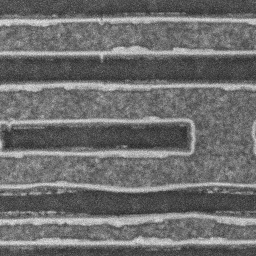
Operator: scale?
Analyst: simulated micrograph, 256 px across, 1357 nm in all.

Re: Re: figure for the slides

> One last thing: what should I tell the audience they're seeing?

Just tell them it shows one or a few lines or trenches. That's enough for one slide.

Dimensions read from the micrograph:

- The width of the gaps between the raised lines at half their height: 170 nm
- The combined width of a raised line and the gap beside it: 343 nanometres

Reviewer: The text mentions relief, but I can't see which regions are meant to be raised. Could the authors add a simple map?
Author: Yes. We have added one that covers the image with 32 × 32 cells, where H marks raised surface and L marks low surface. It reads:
LLLLLLLLLLLLLLLLLLLLLLLLLLLLLLLL
LLLLLLLLLLLLLLLLLLLLLLLLLLLLLLLL
LLLLLLLLLLLHLHHHHHHHHHHHHLLLLLLL
HHHHHHHHHHHHHHHHHHHHHHHHHHHHHHHH
HHHHHHHHHHHHHHHHHHHHHHHHHHHHHHHH
HHHHHHHHHHHHHHHHHHHHHHHHHHHHHHHH
HHHHHHHHHHHHHHHHHHHHHHHHHHHHHHHH
LLLLLLLLLLLLLLLLLLLLLLLLLLLLLLLL
LLLLLLLLLLLLLLLLLLLLLLLLLLLLLLLL
LLLLLLLLLLLLLLLLLLLLLLLLLLLLLLLL
LLLLLLLLLLLLLLLLLLLLLLLLLLLLLLLL
HHHHHHHHHHHHHHHHHHHHHHHHHHHHHHHH
HHHHHHHHHHHHHHHHHHHHHHHHHHHHHHHH
HHHHHHHHHHHHHHHHHHHHHHHHHHHHHHHH
HHHHHHHHHHHHHHHHHHHHHHHHHHHHHHHH
LLLLLLLLLLLLLLLLLLLLLLLLHHHHHHHH
LLLLLLLLLLLLLLLLLLLLLLLLHHHHHHHH
LLLLLLLLLLLLLLLLLLLLLLLLHHHHHHHH
LLLLLLLLLLLLLLLLLLLLLLLLHHHHHHHH
HHHHHHHHHHHHHHHHHHHHHHHHHHHHHHHH
HHHHHHHHHHHHHHHHHHHHHHHHHHHHHHHH
HHHHHHHHHHHHHHHHHHHHHHHHHHHHHHHH
HHHHHHHHHHHHHHHHHHHHHHHHHHHHHHHH
LLLLLLLLLLLLLHHHHHHHHLLLLLLLLLLL
LLLLLLLLLLLLLLLLLLLLLLLLLLLLLLLL
LLLLLLLLLLLLLLLLLLLLLLLLLLLLLLLL
LLLLLLLLLLLLLLLLLLLLLLLLLLLLLLLL
LLLHHHHHHHHHHHHHHHHHHHHHHHHHHHHH
HHHHHHHHHHHHHHHHHHHHHHHHHHHHHHHH
HHHHHHHHHHHHHHHHHHHHHHHHHHHHHHHH
LLLLLLLLLLLLLLLLLLLLLLLLLLLLLLLL
LLLLLLLLLLLLLLLLLLLLLLLLLLLLLLLL